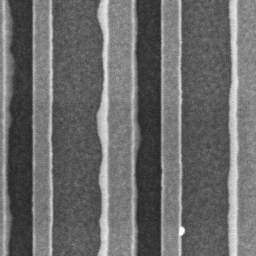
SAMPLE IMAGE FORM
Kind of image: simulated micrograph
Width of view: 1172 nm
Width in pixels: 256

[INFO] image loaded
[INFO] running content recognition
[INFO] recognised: lines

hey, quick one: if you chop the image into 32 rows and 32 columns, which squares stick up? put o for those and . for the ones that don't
o...oo.......oooo...ooo......ooo
o...oo.......oooo...oo.......ooo
o...oo.......oooo...oo.......ooo
o...oo.......oooo...ooo......ooo
o...oo.......oooo...ooo......ooo
o...oo.......oooo...ooo......ooo
o...oo.......oooo...ooo......ooo
o...oo.......oooo...oo.......ooo
o...oo.......oooo...oo.......ooo
o...oo.......oooo...ooo......ooo
o...oo.......oooo...ooo......ooo
o...oo.......oooo...ooo......ooo
o...oo.......oooo...ooo......ooo
o...oo.......oooo...ooo......ooo
o...oo.......oooo...ooo......ooo
o...oo.......oooo...ooo......ooo
o...oo.......oooo...ooo......ooo
o...oo.......oooo...ooo......ooo
o...oo.......oooo...oo.......ooo
o...oo.......oooo...ooo......ooo
o...oo.......oooo...ooo......ooo
o...oo.......oooo...ooo......ooo
o...oo.......oooo...ooo......ooo
o...oo.......oooo...ooo......ooo
o...oo.......oooo...ooo......ooo
o...oo.......oooo...ooo......ooo
o...oo.......oooo...ooo......ooo
o...oo.......oooo...ooo......ooo
o...oo.......oooo...ooo......ooo
o...oo.......oooo...ooo......ooo
o...oo.......oooo...oo.......ooo
o...oo.......oooo...ooo......ooo